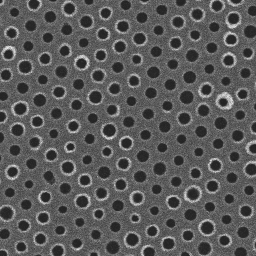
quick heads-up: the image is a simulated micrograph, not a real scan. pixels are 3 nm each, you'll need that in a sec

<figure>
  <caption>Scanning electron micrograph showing a regular array of holes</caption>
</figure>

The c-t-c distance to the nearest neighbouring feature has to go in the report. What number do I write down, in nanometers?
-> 62.1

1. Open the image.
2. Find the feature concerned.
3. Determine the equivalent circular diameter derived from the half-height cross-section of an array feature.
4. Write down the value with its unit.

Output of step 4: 29.2 nanometers